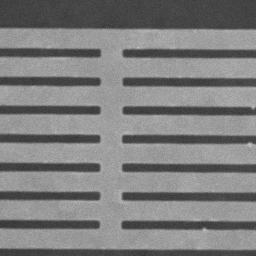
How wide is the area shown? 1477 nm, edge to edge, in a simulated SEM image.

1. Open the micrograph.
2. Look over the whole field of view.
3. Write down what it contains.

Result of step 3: groups of lines, slits or small figures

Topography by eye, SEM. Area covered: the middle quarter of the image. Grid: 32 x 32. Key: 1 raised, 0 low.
10111111111111111111111111111111
00011111111111111111111111111111
11111111111111111111111111111111
00000000011111100000000000000000
00000000011111000000000000000000
00000000011111100000000000000000
11111111111111111111111111111111
11111111111111111111111111111111
11111111111111111111111111111111
11111111111111111111111111111111
00000000011111100000000000000000
00000000011111000000000000000000
00000000011111100000000000000000
11111111111111111111111111111111
11111111111111111111111111111111
11111111111111111111111111111111
11111111111111110111111111111111
00000000011111100000000011111111
00000000011111000000000000000000
00000000011111000000000000000000
11111111111111111111111111111111
11111111111111111111111111111111
11111111111111111111111111111111
11111111111111111111111111111111
11110000111111111111111111111111
00000000011111000000000000000000
00000000011111000000000000000000
11111111111111111111111111111111
11111111111111111111111111111111
11111111111111111111111111111111
11111111111111111111111111111111
11111111111111111111111111111111